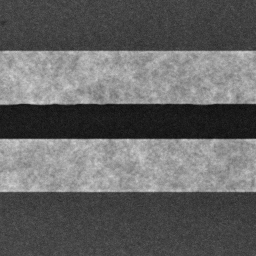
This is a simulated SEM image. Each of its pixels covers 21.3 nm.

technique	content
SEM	lines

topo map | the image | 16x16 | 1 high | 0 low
0000000000000000
0000000000000000
0000000000000000
1111111111111111
1111111111111111
1111111111111111
1011101000001100
0000000000000000
0000000000000000
1111111111111111
1111111111111111
1111111111111111
0000000000000000
0000000000000000
0000000000000000
0000000000000000